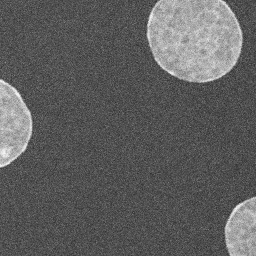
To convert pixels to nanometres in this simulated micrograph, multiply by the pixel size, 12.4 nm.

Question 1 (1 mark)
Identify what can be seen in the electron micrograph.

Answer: raised bodies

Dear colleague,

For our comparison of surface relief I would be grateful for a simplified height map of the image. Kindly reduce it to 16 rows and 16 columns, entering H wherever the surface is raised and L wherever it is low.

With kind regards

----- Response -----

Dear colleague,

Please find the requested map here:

LLLLLLLLLLHHHHLL
LLLLLLLLLHHHHHHL
LLLLLLLLLHHHHHHL
LLLLLLLLLLHHHHHL
LLLLLLLLLLLHHHLL
HLLLLLLLLLLLLLLL
HHLLLLLLLLLLLLLL
HHLLLLLLLLLLLLLL
HHLLLLLLLLLLLLLL
HLLLLLLLLLLLLLLL
LLLLLLLLLLLLLLLL
LLLLLLLLLLLLLLLL
LLLLLLLLLLLLLLLL
LLLLLLLLLLLLLLHH
LLLLLLLLLLLLLLHH
LLLLLLLLLLLLLLHH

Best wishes